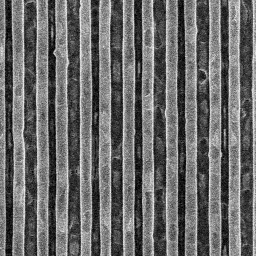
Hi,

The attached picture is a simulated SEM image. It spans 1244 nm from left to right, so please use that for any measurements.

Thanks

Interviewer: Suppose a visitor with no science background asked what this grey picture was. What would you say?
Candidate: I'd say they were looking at parallel lines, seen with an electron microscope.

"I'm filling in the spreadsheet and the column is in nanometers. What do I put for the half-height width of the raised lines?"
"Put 53.5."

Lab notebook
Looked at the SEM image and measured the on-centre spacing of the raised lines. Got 105 nm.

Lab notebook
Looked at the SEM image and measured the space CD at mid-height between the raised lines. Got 0.0528 um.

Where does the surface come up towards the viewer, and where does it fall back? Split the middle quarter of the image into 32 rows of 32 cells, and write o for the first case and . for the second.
o...ooo..ooo...oo...oo....oo..oo
o...ooo..ooo...oo...oo....oo..oo
o...ooo..ooo...oo...oo....oo..oo
o...ooo..ooo...oo...oo....oo..oo
o...ooo..ooo...oo...oo....oo..oo
o...ooo..ooo...oo...oo....oo..oo
o...ooo..ooo...oo...oo....oo..oo
o...ooo..ooo...ooo..oo....oo..oo
o...ooo..ooo...ooo..oo....oo..oo
o...ooo..ooo...ooo..oo....oo..oo
o...ooo..ooo...ooo..oo....oo..oo
o...ooo..ooo...ooo..oo...ooo..oo
o...ooo..ooo...ooo..oo...ooo..oo
o...ooo..ooo...ooo..oo...ooo..oo
o...ooo..ooo...ooo..oo....oo..oo
o...ooo..ooo...ooo..oo....oo..oo
o...ooo..ooo...ooo..oo....oo..oo
o...ooo..ooo...ooo..oo....oo..oo
o...ooo..ooo...ooo..oo....oo..oo
o...ooo..ooo...oo...oo....oo..oo
o...ooo..ooo...oo...oo....oo..oo
o...ooo..ooo...oo...oo....oo..oo
o...ooo..ooo...oo...oo....oo...o
o...ooo..ooo...oo...oo....oo...o
o...ooo..ooo...ooo..oo....oo..oo
o...ooo..ooo...ooo..oo....oo..oo
o...ooo..ooo...ooo..oo....oo..oo
o...ooo..ooo...ooo..oo....oo..oo
o...ooo..ooo...ooo..oo....oo...o
o...ooo..ooo...ooo..oo....oo...o
o...ooo..ooo...ooo..oo....oo...o
o...ooo..ooo...ooo..oo....oo...o